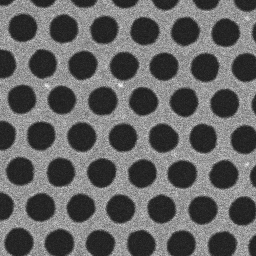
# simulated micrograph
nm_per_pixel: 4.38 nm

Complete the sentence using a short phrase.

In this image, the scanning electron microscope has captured a regular array of holes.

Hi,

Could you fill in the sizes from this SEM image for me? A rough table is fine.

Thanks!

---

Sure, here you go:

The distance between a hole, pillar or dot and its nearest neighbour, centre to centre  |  176 nm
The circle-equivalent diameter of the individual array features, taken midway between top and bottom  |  127 nm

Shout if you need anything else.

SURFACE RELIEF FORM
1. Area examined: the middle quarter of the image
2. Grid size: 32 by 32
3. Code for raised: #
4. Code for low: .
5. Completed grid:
#.......###........##........###
#.......###........##.......####
##......####......####......####
###...#######....######....#####
################################
################################
..#####.....######....######....
...###.......####......####.....
...###.......####......###......
...###.......###........##......
...###.......###.......####.....
..#####......####......####.....
.#######....######...#######....
################################
################################
##.....######....######....#####
#.......####......####......####
#.......###.......###.......###.
#.......###.......###........##.
#.......###.......###........##.
##.....#####......####......####
###...#######....######....#####
################################
#########.######################
..#####.....######....######....
..####.......###.......####.....
...###.......###.......###......
...###.......###.......###......
..####.......###.......###......
..#####.....####.......###......
.#######...#######...######.....
################################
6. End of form